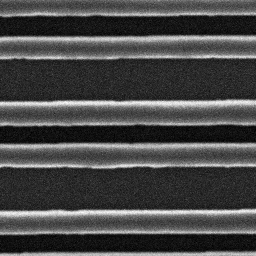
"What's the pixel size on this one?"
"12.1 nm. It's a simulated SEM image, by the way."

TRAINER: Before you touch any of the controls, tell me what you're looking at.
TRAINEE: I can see lines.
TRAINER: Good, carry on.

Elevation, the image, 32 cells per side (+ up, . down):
++++++++++++++++++++++++++++++++
++++++++++++++++++++++++++++++++
................................
................................
.......................++.......
++++++++++++++++++++++++++++++++
++++++++++++++++++++++++++++++++
................................
................................
................................
................................
................................
................................
++++++++++++++++++++++++++++++++
++++++++++++++++++++++++++++++++
+++++++++++++++++.+.+++++++..+++
................................
................................
++++++++++++++++++++++++++++++++
++++++++++++++++++++++++++++++++
++++++++++++++++++++++++++++++++
................................
................................
................................
................................
................................
.....+++++++++++++++++++++++++++
++++++++++++++++++++++++++++++++
++++++++++++++++++++++++++++++++
................................
................................
................................